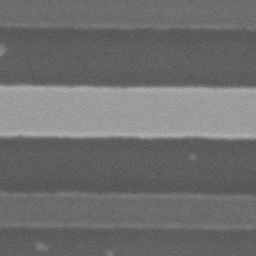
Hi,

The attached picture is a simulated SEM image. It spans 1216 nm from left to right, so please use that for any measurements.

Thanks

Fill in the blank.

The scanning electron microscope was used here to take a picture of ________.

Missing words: lines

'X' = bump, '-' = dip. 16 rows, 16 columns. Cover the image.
XXXXXXXXXXXXXXXX
XXXXXXXXXXXXXXXX
----------------
----------------
----------------
XXXXXX----------
XXXXXXXXXXXXXXXX
XXXXXXXXXXXXXXXX
---XXXX-XXXXXXXX
----------------
----------------
----------------
XXXXXXXXXXXXXXXX
XXXXXXXXXXXXXXXX
----------------
----------------